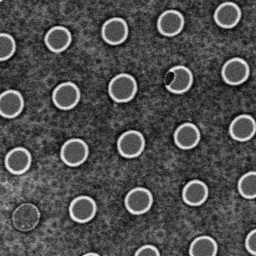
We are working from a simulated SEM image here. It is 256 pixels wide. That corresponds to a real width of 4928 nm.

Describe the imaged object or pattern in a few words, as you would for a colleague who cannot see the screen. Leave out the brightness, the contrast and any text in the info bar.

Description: a regular array of raised bodies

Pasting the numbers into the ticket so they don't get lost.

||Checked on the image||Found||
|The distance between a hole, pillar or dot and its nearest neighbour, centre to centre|1.09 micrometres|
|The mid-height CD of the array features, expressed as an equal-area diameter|485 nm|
